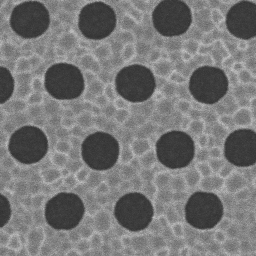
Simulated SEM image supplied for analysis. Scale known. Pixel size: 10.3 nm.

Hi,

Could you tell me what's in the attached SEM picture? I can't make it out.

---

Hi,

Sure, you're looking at a regular array of holes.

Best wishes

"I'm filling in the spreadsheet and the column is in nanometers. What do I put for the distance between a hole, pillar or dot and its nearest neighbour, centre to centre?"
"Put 713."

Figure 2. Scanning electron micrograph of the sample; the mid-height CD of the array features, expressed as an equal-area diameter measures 408 nanometers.